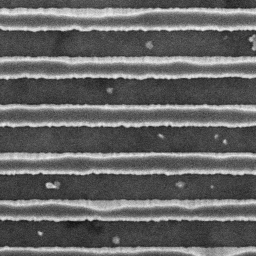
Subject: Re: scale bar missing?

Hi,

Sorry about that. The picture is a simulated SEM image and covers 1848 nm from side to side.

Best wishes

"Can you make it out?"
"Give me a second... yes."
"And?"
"lines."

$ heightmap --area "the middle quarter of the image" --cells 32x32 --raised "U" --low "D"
UUUUUUUUUUUUUUUUUUUUUUUUUUUUUUUU
UUUUUUUUUUUUUUUUUUUUUUUUUUUUUUUU
UUUUUUUUUUUUUUUUUUUUUUUUUUUUUUUU
UDDDDDDDDDDDUDDUUUUUUDDUUUUUDDDU
DDDDDDDDDDDDDDDDDDDDDDDDDDDDDDDD
DDDDDDDDDDDDDDDDDDDDDDDDDDDDDDDD
DDDDDDDDDDDDDDDDDDDDDDDDDDDDDDDD
DDDDDDDDDDDDDDDDDDDDDDDDDDDDDDDD
DDDDDDDDDDDDDDDDDDDDDDDDDDDDDDDD
DDDDDDDDDDDDDDDDDDDDDDDDDDDDDDDD
DUDUDUDDDDDDDDDDDDDDDDDDDDDDDDDD
UUUUUUUUUUUUUUUUUUUUUUUUUUUUUUUU
UUUUUUUUUUUUUUUUUUUUUUUUUUUUUUUU
UUUUUUUUUUUUUUUUUUUUUUUUUUUUUUUU
UUUUUUUUUUUUUUUUUUUUUUUUUUUUUUUU
UUUUDUUUUUUUUUDUUUUUUDUUDUDUUUUD
DDDDDDDDDDDDDDDDDDDDDDDDDDDDDDDD
DDDDDDDDDDDDDDDDDDDDDDDDDDDDDDDD
DDDDDDDDDDDDDDDDDDDDDDDDDDDDDDDD
DDDDDDDDDDDDDDDDDDDDDDDDDDDDDDDD
DDDDDDDDDDDDDDDDDDDDDDDDDDDDDDDD
DDDDDDDDDDDDDDDDDDDDDDDDDDDDDDDD
DDDDDDDDDDDDDDDDDDDDDUUUDUDDDDDD
UUUUUUUUUUUUUUUUUUUUUUUUUUUUUUUU
UUUUUUUUUUUUUUUUUUUUUUUUUUUUUUUU
UUUUUUUUUUUUUUUUUUUUUUUUUUUUUUUU
UUUUUUUUUUUUUUUUUUUUUUUUUUUUUUUU
DUDUUUDDDDDDDDDDDDUDDUDDDUUDUDDD
DDDDDDDDDDDDDDDDDDDDDDDDDDDDDDDD
DDDDDDDDDDDDDDDDDDDDDDDDDDDDDDDD
DDDDDDDDDDDDDDDDDDDDDDDDDDDDDDDD
DDDDDDDDDDDDDDDDDDDDDDDDDDDDDDDD